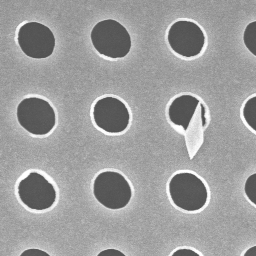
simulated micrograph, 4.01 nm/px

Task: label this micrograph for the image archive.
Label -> a regular array of holes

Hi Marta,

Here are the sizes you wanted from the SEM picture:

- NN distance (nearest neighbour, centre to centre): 300 nanometers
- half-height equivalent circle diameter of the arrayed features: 0.149 microns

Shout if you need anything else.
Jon